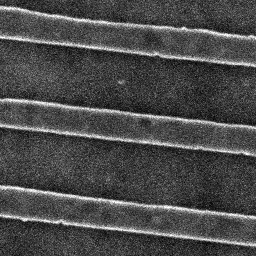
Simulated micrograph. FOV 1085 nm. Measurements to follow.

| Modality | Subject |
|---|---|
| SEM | one or a few lines or trenches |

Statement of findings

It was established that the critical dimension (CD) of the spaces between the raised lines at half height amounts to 0.257 µm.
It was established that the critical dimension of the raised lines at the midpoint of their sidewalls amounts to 120 nm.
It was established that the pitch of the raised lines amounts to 377 nanometers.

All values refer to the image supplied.